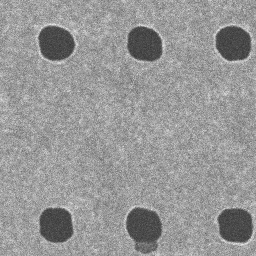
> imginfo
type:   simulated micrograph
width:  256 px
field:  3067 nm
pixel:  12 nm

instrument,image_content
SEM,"holes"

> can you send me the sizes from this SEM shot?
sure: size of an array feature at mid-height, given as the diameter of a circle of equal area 434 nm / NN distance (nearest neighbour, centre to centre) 1060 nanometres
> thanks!